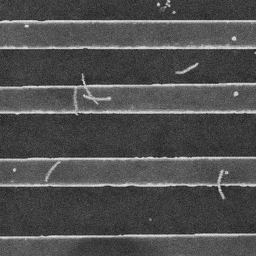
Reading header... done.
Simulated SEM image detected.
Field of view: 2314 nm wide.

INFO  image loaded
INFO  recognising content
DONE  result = lines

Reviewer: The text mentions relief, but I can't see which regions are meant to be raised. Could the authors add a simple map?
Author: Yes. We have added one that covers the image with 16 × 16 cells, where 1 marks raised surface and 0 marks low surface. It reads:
0000000000000000
1111111111111111
1111111111111111
0000000000000000
0000000000000000
1111111111111111
1111111111111111
0000000000000000
0000000000000000
0000000000000000
1111111111111111
1111111111111111
0000000000000000
0000000000000000
0000000000000000
1111111111111111